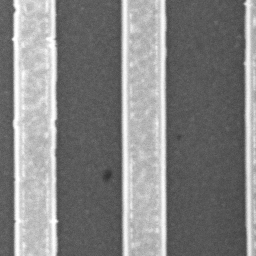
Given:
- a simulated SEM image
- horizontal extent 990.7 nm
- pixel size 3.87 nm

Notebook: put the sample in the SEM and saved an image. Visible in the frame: one or a few lines or trenches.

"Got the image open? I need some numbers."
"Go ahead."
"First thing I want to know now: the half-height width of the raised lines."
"144 nm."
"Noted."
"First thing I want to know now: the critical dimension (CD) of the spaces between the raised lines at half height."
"0.303 micrometres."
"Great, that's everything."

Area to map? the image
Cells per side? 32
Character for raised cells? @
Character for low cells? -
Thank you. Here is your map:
--@@@@@---------@@@@-----------@
--@@@@@---------@@@@-----------@
--@@@@@---------@@@@-----------@
--@@@@@---------@@@@-----------@
--@@@@@---------@@@@-----------@
--@@@@@---------@@@@-----------@
--@@@@@---------@@@@-----------@
--@@@@@---------@@@@-----------@
--@@@@@---------@@@@-----------@
--@@@@@---------@@@@-----------@
--@@@@@---------@@@@-----------@
--@@@@@---------@@@@-----------@
--@@@@@---------@@@@-----------@
--@@@@@---------@@@@-----------@
--@@@@@---------@@@@-----------@
--@@@@@---------@@@@-----------@
--@@@@@---------@@@@-----------@
--@@@@@---------@@@@-----------@
--@@@@@---------@@@@-----------@
--@@@@@---------@@@@-----------@
--@@@@@---------@@@@-----------@
--@@@@@---------@@@@-----------@
--@@@@@---------@@@@-----------@
--@@@@@---------@@@@-----------@
--@@@@@---------@@@@-----------@
--@@@@@---------@@@@-----------@
--@@@@@---------@@@@-----------@
--@@@@@---------@@@@-----------@
--@@@@@---------@@@@-----------@
--@@@@@---------@@@@-----------@
--@@@@@---------@@@@-----------@
--@@@@@---------@@@@-----------@